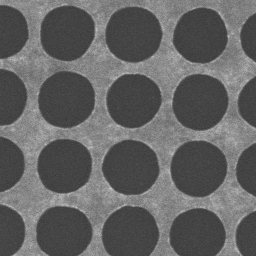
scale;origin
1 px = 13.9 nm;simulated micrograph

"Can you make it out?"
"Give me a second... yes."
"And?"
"a regular array of holes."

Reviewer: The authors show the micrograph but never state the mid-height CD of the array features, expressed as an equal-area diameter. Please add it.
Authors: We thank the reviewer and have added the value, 786 nm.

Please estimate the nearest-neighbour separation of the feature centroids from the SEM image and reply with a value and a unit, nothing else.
926 nm